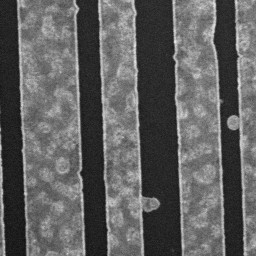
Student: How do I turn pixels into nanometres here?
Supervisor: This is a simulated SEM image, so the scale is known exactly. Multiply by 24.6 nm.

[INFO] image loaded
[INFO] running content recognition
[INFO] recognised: one or a few lines or trenches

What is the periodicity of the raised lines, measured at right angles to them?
1810 nm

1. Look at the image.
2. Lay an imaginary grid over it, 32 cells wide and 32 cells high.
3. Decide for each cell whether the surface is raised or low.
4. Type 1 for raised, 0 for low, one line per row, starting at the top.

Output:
00111111100011111000001111100011
00111111110001111000001111100011
00111111100001111000001111100011
00111111100001111000001111100011
00011111100001111000001111100011
00111111110001111000001111100011
00111111110001111000001111100011
00011111110001111000001111100011
00011111110001111000001111100011
00011111110001111000001111100011
00011111110001111000001111100011
00011111110001111000001111100011
00011111110001111000001111100011
00011111110001111000001111100011
00011111110001111000001111100011
00011111110001111000001111100011
00011111110001111000001111100011
00011111110001111000001111100011
00011111110001111000001111100011
00011111110001111000001111110011
00011111110001111000001111110011
00011111110001111000001111110011
00011111110001111000000111110011
00011111110001111100000111110011
00011111110001111100000111110001
00011111110001111100000111110011
00011111110001111000000111110011
00011111110001111100000111110001
00011111110000111100000111110001
00011111110000111100000111110001
00011111110000111100000111110001
00011111111000111100000111110001